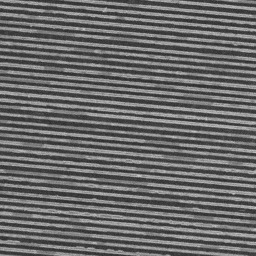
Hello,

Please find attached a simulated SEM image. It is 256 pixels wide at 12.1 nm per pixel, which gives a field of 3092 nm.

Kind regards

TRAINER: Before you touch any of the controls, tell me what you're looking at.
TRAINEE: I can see parallel lines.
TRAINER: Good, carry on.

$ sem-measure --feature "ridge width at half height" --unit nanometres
34.6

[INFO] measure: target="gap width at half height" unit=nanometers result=46.6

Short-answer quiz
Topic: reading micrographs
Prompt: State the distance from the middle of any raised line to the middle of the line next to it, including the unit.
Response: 0.0854 micrometres